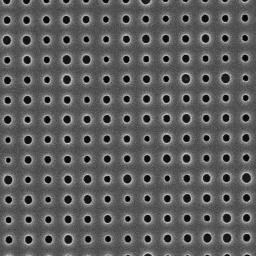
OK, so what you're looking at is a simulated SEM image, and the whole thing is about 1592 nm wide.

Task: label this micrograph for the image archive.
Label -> a regular array of holes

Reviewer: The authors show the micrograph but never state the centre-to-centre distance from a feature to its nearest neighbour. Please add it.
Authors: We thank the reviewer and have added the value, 0.122 micrometres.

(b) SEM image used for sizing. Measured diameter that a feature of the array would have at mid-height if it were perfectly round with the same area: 45.7 nanometres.